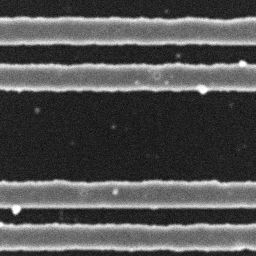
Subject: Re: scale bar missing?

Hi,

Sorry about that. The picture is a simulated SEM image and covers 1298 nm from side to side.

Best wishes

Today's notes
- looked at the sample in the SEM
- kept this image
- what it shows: lines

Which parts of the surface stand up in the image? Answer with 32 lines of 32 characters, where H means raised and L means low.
LLLLLLLLLLLLLLLLLLLLLLLLLLLLLLLL
LLLLLLLLLLLLLLLLLLLLLLLLLLLLLLLL
HHHHHHHHHHHHHHHHHHHHHHHHHHHHHHHH
HHHHHHHHHHHHHHHHHHHHHHHHHHHHHHHH
HHHHHHHHHHHHHHHHHHHHHHHHHHHHHHHH
HHHHHHHLHHHHHHHHLHHHHLHHLHHHHHHH
LLLLLLLLLLLLLLLLLLLLLLLLLLLLLLLL
LLLLLLLLLLLLLLLLLLLLLLLLLLLLLLLL
HHHHHHHHHHHHHHHHHHHHHHHHHHHHHHHH
HHHHHHHHHHHHHHHHHHHHHHHHHHHHHHHH
HHHHHHHHHHHHHHHHHHHHHHHHHHHHHHHH
LLLLLLLLLLLLLLLLLLLLLLLLLHLLLLLL
LLLLLLLLLLLLLLLLLLLLLLLLLLLLLLLL
LLLLLLLLLLLLLLLLLLLLLLLLLLLLLLLL
LLLLLLLLLLLLLLLLLLLLLLLLLLLLLLLL
LLLLLLLLLLLLLLLLLLLLLLLLLLLLLLLL
LLLLLLLLLLLLLLLLLLLLLLLLLLLLLLLL
LLLLLLLLLLLLLLLLLLLLLLLLLLLLLLLL
LLLLLLLLLLLLLLLLLLLLLLLLLLLLLLLL
LLLLLLLLLLLLLLLLLLLLLLLLLLLLLLLL
LLLLLLLLLLLLLLLLLLLLLLLLLLLLLLLL
LLLLLLLLLLLLLLLLLLLLLLLLLLLLLLLL
LLLLLLLLLLLLLLLLLLLLLLLLLLLLLLLL
HHHHHHHHHHHHHHHHHHHHHHHHHHHHHHHH
HHHHHHHHHHHHHHHHHHHHHHHHHHHHHHHH
HHHHHHHHHHHHHHHHHHHHHHHHHHHHHHHH
LLLLLLLLLLLLLLLLLLLLLLLLLLLLLLLL
LLLLLLLLLLLLLLLLLLLLLLLLLLLLLLLL
HHHHHHHHHHHHHHHHHHHHHHHHHHHHHHHH
HHHHHHHHHHHHHHHHHHHHHHHHHHHHHHHH
HHHHHHHHHHHHHHHHHHHHHHHHHHHHHHHH
LLLLLLLLLLLLLLLLLLLLLLLLLLLLLLLL